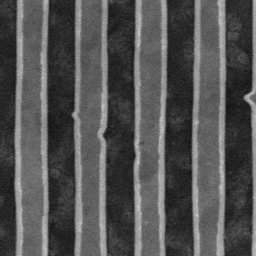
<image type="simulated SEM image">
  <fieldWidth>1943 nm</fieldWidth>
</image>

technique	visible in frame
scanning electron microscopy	parallel lines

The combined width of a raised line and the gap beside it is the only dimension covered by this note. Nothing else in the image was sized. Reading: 449 nm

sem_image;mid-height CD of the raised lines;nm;201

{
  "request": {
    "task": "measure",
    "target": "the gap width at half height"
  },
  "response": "33 pixels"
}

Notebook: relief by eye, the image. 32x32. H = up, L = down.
LLHHHHLLLLHHHLLLLHHHHLLLLHHHLLLL
LLHHHHLLLLHHHLLLLHHHHLLLLHHHLLLL
LLHHHHLLLLHHHLLLLHHHHLLLLHHHLLLL
LLHHHHLLLLHHHLLLLHHHHLLLLHHHLLLL
LLHHHLLLLLHHHLLLLHHHHLLLLHHHLLLL
LLHHHLLLLLHHHLLLLHHHHLLLLHHHLLLL
LLHHHLLLLLHHHLLLLHHHHLLLLHHHLLLL
LLHHHLLLLLHHHLLLLHHHHLLLLHHHLLLL
LLHHHLLLLLHHHLLLLHHHHLLLLHHHLLLL
LLHHHLLLLLHHHLLLLHHHLLLLLHHHLLLL
LLHHHLLLLLHHHLLLLHHHLLLLLHHHLLLL
LLHHHLLLLLHHHLLLLHHHLLLLLHHHLLLH
LLHHHLLLLLHHHLLLLHHHLLLLLHHHLLLH
LLHHHLLLLHHHHLLLLHHHLLLLLHHHLLLL
LLHHHLLLLHHHHLLLLHHHLLLLHHHHLLLL
LLHHHHLLLLHHHLLLLHHHLLLLHHHHLLLL
LLHHHHLLLLHHHLLLLHHHLLLLHHHHLLLL
LLHHHLLLLLHHHLLLLHHHLLLLHHHHLLLL
LLHHHHLLLLHHHLLLLHHHLLLLHHHHLLLL
LLHHHHLLLLHHHLLLLHHHLLLLHHHHLLLL
LLHHHHLLLLHHHLLLLHHHLLLLHHHHLLLL
LLHHHHLLLLHHHLLLLHHHLLLLHHHHLLLL
LLHHHHLLLLHHHLLLLHHHLLLLHHHHLLLL
LLHHHHLLLLHHHLLLLHHHLLLLHHHHLLLL
LLHHHHLLLLHHHLLLLHHHLLLLHHHHLLLL
LLHHHHLLLLHHHLLLLHHHLLLLHHHHLLLL
LLHHHHLLLLHHHLLLLHHHLLLLHHHHLLLL
LLHHHHLLLLHHHLLLLHHHLLLLHHHHLLLL
LLHHHHLLLLHHHLLLLHHHLLLLLHHHLLLL
LLHHHHLLLLHHHLLLLHHHLLLLLHHLLLLL
LLHHHHLLLLHHHLLLLHHHLLLLLHHLLLLL
LLHHHHLLLLHHHLLLLHHHLLLLLHHLLLLL